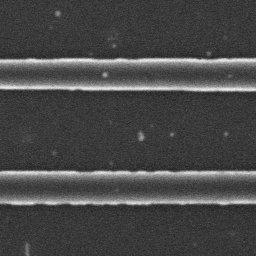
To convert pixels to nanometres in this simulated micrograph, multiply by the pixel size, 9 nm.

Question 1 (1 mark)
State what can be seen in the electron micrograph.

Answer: lines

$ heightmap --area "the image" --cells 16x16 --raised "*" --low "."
................
................
................
................
****************
****************
................
................
................
................
................
****************
****************
................
................
................